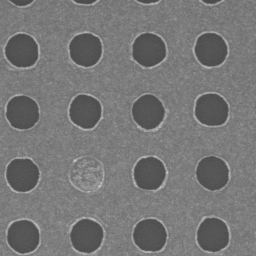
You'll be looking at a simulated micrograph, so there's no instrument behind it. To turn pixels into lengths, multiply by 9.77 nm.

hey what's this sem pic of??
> a regular array of holes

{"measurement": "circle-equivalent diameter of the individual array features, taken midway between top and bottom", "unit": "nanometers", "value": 334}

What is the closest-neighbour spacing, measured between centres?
603 nanometers